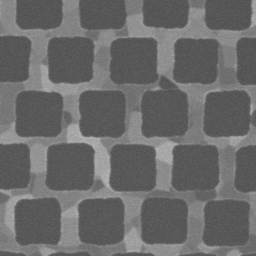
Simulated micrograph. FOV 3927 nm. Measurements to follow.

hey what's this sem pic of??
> a regular array of holes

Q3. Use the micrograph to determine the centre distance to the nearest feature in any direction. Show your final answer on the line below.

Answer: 0.944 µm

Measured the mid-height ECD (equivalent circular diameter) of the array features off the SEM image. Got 52.6 pixels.